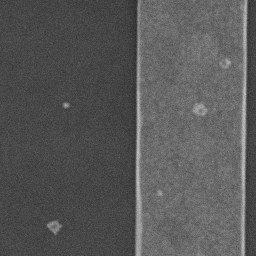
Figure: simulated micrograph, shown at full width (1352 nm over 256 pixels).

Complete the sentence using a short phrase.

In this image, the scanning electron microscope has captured wiring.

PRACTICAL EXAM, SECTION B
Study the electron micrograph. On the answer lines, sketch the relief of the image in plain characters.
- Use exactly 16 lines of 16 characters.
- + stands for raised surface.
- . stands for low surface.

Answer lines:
.........++++++.
.........++++++.
.........++++++.
.........++++++.
.........++++++.
.........++++++.
.........++++++.
.........++++++.
.........++++++.
.........++++++.
.........++++++.
.........++++++.
.........++++++.
.........++++++.
.........++++++.
.........++++++.